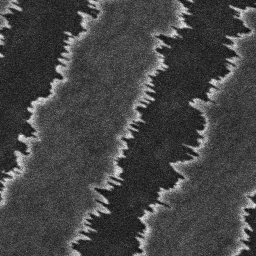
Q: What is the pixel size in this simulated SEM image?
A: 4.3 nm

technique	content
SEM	one or a few lines or trenches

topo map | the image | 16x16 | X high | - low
X-----XXXXX-----
-----XXXXXX----X
----XXXXXX-----X
----XXXXXX-----X
----XXXXXX----XX
---XXXXXX----XXX
--XXXXXXX---XXXX
--XXXXXX-----XXX
--XXXXXX-----XXX
--XXXXXX----XXXX
-XXXXXX----XXXXX
XXXXXXX----XXXXX
XXXXXX----XXXXXX
XXXXXX---XXXXXX-
XXXXX----XXXXXX-
XXXXX----XXXXXX-